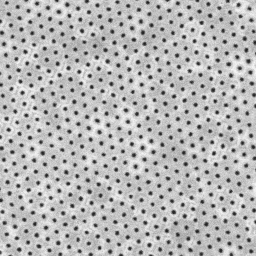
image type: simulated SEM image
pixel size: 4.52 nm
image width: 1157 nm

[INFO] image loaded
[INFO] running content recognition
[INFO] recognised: a regular array of holes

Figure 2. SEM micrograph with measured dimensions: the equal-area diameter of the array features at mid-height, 18.4 nm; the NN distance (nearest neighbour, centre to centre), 0.0503 µm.